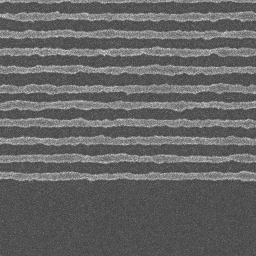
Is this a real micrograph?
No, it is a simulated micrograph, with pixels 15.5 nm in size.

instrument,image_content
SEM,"parallel lines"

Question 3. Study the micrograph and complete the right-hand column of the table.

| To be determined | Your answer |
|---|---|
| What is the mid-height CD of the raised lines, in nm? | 105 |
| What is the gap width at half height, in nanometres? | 170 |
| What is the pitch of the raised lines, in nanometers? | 275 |